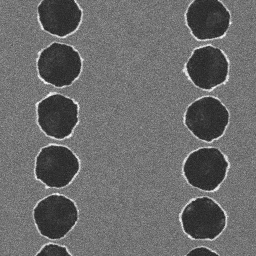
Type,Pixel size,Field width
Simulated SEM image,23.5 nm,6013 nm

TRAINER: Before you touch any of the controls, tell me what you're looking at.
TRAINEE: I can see a regular array of holes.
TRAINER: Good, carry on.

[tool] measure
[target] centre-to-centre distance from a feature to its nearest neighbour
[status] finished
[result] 1.18 µm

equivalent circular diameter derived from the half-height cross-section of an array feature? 1020 nanometres